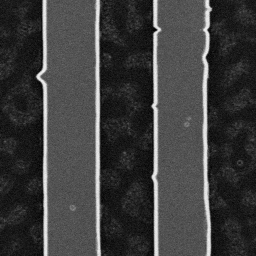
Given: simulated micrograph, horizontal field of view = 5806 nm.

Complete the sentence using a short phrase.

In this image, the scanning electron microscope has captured one or a few lines or trenches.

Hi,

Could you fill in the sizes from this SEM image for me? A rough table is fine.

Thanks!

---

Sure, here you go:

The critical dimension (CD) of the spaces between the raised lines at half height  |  58.1 pixels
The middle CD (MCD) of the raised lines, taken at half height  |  1180 nm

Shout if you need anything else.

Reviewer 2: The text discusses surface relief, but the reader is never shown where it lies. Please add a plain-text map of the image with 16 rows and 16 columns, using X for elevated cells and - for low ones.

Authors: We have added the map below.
---XXX----XXX---
---XXX----XXX---
---XXX----XXX---
---XXX----XXX---
---XXX----XXX---
---XXX----XXX---
---XXX----XXX---
---XXX----XXX---
---XXX----XXX---
---XXX----XXX---
---XXX----XXX---
---XXX----XXX---
---XXX----XXX---
---XXX----XXX---
---XXX----XXX---
---XXX----XXX---